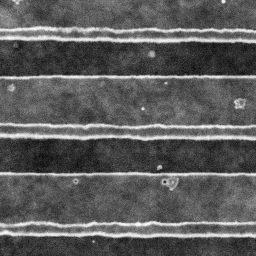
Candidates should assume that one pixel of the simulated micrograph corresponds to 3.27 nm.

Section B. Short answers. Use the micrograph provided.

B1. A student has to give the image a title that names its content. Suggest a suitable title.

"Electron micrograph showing lines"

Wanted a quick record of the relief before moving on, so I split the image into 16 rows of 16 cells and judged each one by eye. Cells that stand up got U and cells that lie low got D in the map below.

UUUUUUUUUUUUUUUU
UUUUUUUUUUUUUUUU
DDDDDDDUUUUUDUUU
DDDDDDDDDDDDDDDD
DDDDDDDDDDDDDDDD
UUUUUUUUUUUUUUUU
UUUUUUUUUUUUUUUU
UUUUUUUUUUUUUUUU
DDUUUUUUUUUUUUUU
DDDDDDDDDDDDDDDD
DDDDDDDDDDDDDDDD
UUUUUUUUUUUUUUUU
UUUUUUUUUUUUUUUU
UUUUUUUUUUUUUUUU
UUUUUUUUUUUUUUUU
DDDDDDDDDDDDDDDD